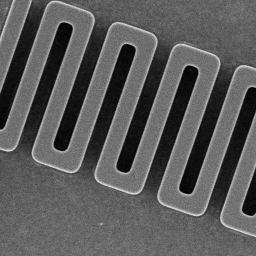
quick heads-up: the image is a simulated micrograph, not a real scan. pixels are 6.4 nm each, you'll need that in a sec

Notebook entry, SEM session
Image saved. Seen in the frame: groups of lines, slits or small figures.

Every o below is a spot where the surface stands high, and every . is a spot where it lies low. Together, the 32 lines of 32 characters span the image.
..oo..oo........................
.ooo..ooooo.....................
.oo..ooooooo....................
ooo..oo..ooo..ooo...............
ooo..oo..oo..oooooo.............
oo..ooo..oo..ooooooo............
oo..oo..ooo..oo..oo..ooooo......
o..ooo..oo..ooo..oo..oooooo.....
o..ooo..oo..oo..ooo..oo.ooo...oo
o..oo..ooo..oo..oo..ooo..oo..ooo
..ooo..oo..ooo..oo..oo..ooo..ooo
..oo...oo..oo..ooo..oo..oo..ooo.
..oo..ooo..oo..oo..ooo..oo..oo..
.ooo..oo..ooo..oo..oo..ooo..oo..
.oo..ooo..oo..ooo..oo..oo..ooo..
.oo..oo...oo..oo..ooo..oo..oo..o
ooo..oo..ooo..oo..oo..ooo..oo..o
oo..ooo..oo..ooo..oo..oo..ooo..o
oo..ooo.ooo..oo..ooo..oo..oo..oo
....oooooo...oo..oo..ooo..oo..oo
.....ooooo..ooo..oo..oo..ooo..oo
........o...ooo.ooo..oo..oo..ooo
............oooooo..ooo..oo..oo.
..............oooo..oo..ooo..oo.
....................oooooo..ooo.
....................oooooo..oo..
.......................oo...oo..
............................oooo
.............................ooo
................................
................................
................................